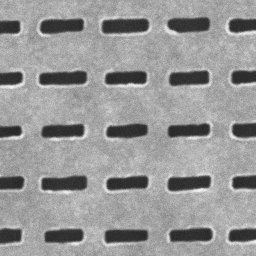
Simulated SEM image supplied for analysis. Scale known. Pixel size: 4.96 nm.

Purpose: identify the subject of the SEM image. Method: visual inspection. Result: a regular array of holes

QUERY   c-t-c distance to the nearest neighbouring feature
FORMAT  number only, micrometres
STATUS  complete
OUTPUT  0.259